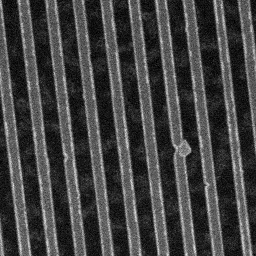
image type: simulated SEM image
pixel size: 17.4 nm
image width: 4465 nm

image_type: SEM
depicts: parallel lines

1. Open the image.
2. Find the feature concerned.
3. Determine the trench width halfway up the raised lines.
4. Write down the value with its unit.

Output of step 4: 18 pixels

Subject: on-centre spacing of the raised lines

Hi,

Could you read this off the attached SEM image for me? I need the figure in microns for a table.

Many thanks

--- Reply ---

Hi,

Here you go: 0.48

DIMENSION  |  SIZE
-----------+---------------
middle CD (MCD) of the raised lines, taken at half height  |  167 nm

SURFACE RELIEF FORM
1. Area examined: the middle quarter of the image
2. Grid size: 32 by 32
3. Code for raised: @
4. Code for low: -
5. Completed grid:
----@@@----@@-----@@-----@@-----
----@@@----@@@----@@@----@@-----
-----@@-----@@----@@@----@@@----
-----@@-----@@-----@@----@@@----
-----@@-----@@-----@@-----@@----
-----@@-----@@-----@@-----@@----
@----@@-----@@-----@@-----@@----
@----@@-----@@-----@@-----@@----
@----@@@----@@-----@@@----@@----
@----@@@----@@@----@@@----@@----
@-----@@----@@@----@@@----@@----
@-----@@-----@@----@@@----@@@---
@-----@@-----@@-----@@----@@@---
@-----@@-----@@-----@@-----@@---
@-----@@-----@@-----@@-----@@---
@-----@@-----@@-----@@-----@@---
@@----@@-----@@-----@@@----@@---
@@----@@@----@@-----@@@----@@---
@@----@@@----@@@----@@@----@@---
@@-----@@----@@@----@@@----@@@@-
@@-----@@-----@@-----@@-----@@@-
@@-----@@-----@@-----@@-----@@@@
@@-----@@-----@@-----@@-----@@@-
@@-----@@-----@@-----@@-----@@--
@@-----@@-----@@-----@@-----@@--
@@@----@@-----@@@----@@-----@@--
@@@----@@@-----@@----@@-----@@--
-@@----@@@-----@@----@@@----@@--
-@@-----@@-----@@----@@@----@@@-
-@@-----@@-----@@-----@@----@@@-
-@@-----@@-----@@-----@@-----@@-
-@@-----@@-----@@-----@@-----@@-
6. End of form